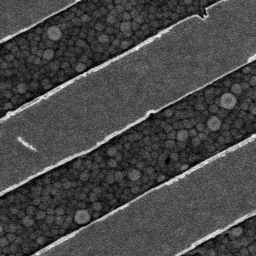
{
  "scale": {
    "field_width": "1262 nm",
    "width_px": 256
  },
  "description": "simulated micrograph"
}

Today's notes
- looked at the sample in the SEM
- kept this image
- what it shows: one or a few lines or trenches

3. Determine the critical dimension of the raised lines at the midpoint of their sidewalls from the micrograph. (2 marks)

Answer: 342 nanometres